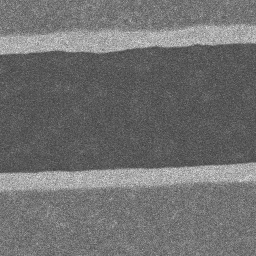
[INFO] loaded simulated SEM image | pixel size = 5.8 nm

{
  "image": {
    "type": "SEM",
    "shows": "one or a few lines or trenches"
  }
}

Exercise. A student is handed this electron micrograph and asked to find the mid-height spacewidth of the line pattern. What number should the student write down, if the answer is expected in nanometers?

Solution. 780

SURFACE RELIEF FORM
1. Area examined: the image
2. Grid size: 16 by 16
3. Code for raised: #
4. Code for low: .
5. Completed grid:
################
################
##########......
................
................
................
................
................
................
................
................
################
################
################
################
################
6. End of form